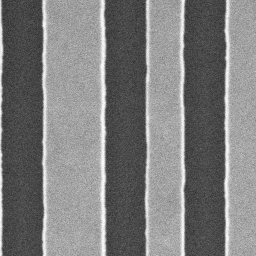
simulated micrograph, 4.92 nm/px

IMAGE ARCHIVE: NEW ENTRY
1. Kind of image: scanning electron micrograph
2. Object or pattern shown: lines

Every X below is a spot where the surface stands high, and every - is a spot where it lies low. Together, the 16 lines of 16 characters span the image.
---XXX---XX---XX
---XXXX--XX---XX
---XXXX--XX---XX
---XXXX--XX---XX
---XXXX--XX---XX
---XXXX--XX---XX
---XXXX--XX---XX
---XXXX--XX---XX
---XXXX--XX---XX
---XXXX--XX---XX
---XXXX--XXX--XX
---XXXX--XX---XX
---XXXX--XX---XX
---XXXX--XX---XX
---XXXX--XX---XX
---XXXX--XX---XX